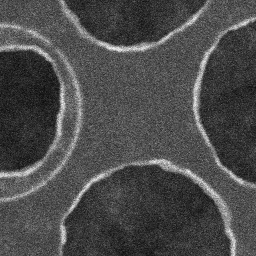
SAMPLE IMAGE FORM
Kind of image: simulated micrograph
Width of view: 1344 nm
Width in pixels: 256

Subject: holes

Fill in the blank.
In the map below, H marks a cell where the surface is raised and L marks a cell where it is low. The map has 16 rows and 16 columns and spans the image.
HHHHLLLLLLLLLHHH
HHHHHLLLLLLLHHHL
HHHHHHLLLLHHHHLL
LLLHHHHHHHHHHLLL
LLLHHHHHHHHHHLLL
LLLLHHHHHHHHLLLL
LLLLHHHHHHHHLLLL
LLLLHHHHHHHHLLLL
LLLHHHHHHHHHHLLL
LLLHHHHHHHHHHLLL
LLHHHHHHLLLHHHLL
HHHHHHLLLLLLHHHH
HHHHHLLLLLLLLHHH
HHHHLLLLLLLLLLHH
HHHHLLLLLLLLLLHH
HHHHLLLLLLLLLLHH